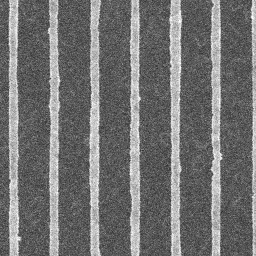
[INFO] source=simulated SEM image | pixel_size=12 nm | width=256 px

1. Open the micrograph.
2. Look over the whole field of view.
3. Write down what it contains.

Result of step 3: parallel lines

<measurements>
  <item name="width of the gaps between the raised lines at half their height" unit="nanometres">391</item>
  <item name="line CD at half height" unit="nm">96.3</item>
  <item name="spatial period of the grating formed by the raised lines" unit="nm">488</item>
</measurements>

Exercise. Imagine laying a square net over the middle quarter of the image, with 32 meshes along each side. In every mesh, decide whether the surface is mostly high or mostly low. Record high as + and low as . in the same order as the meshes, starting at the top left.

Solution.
.......++........++........++...
.......++........++........++...
.......++........++........++...
.......++........++........++...
.......++........++........++...
.......++........+.........++...
.......++........++........++...
.......++........++........++...
.......++........++........++...
.......++........++........++...
.......++........++........++...
.......++........++........++...
.......++........++........++...
.......++........++........++...
.......++........++........++...
.......++........++........++...
.......++........++........++...
.......++........++........++...
.......++........++........++...
.......++........++........++...
.......++........++........++...
.......++........++........++...
.......++........++........++...
......+++........++........++...
.......++........++........++...
.......++........++........++...
.......++........++........++...
.......++........++........++...
......+++........++........++...
......++.........++........++...
.......+.........++........++...
.......+.........++........++...